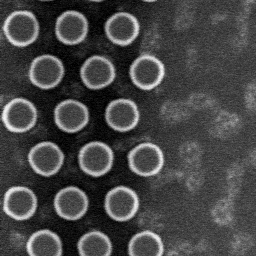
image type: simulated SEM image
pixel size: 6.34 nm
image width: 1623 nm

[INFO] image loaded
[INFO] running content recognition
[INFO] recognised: a regular array of raised bodies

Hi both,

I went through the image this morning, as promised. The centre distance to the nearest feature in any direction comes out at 315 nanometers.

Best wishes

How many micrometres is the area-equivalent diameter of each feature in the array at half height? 0.203